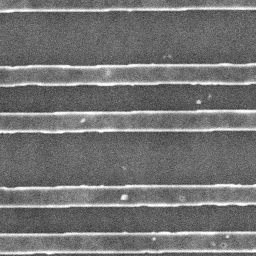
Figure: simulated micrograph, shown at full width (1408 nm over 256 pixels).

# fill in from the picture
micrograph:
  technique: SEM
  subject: lines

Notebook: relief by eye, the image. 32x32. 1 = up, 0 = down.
11111111111111111111111111111111
00000000000000000000000000000000
00000000000000000000000000000000
00000000000000000000000000000000
00000000000000000000000000000000
00000000000000000000000000000000
00000000000000000000000000000000
00000000000000000000000000000000
11111111111111111111111111111111
11111111111111111111111111111111
11111111110011000000000000000000
00000000000000000000000000000000
00000000000000000000000000000000
00000000000000000000000000000000
11111111111111111111111111111111
11111111111111111111111111111111
01000111000000000000000000000000
00000000000000000000000000000000
00000000000000000000000000000000
00000000000000000000000000000000
00000000000000000000000000000000
00000000000000000000000000000000
00000000000000000000000000000000
10111111111111111111111111111111
11111111111111111111111111111111
11111111111111111111111110011010
00000000000000000000000000000000
00000000000000000000000000000000
00000000000000000000000000000000
11111111111111111111111111111111
11111111111111111111111111111111
11111111111111111111100000000000